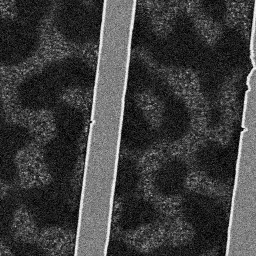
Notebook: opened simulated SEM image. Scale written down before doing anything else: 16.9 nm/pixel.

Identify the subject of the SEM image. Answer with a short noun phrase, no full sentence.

one or a few lines or trenches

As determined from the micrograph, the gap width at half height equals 2.04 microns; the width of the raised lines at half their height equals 494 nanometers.